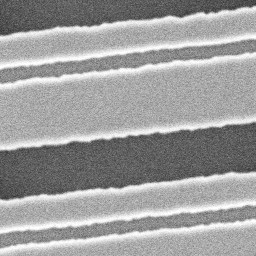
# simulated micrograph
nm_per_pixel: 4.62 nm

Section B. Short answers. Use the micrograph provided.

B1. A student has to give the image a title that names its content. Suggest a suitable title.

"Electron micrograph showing lines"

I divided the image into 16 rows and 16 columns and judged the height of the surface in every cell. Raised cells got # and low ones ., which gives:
...............#
.......#########
################
################
################
################
################
################
#######.........
................
................
.........#######
.###############
################
################
################